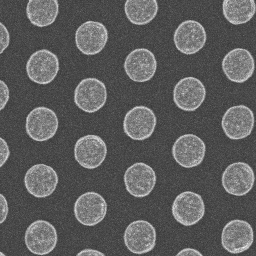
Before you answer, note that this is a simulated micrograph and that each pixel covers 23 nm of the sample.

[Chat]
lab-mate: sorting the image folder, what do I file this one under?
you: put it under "a regular array of raised bodies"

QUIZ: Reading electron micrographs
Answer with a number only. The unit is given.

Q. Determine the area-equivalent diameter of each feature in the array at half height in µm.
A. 0.744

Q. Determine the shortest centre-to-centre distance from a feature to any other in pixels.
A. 56.3